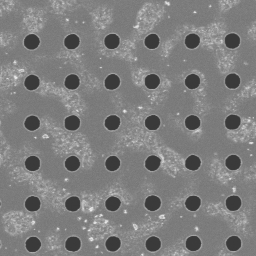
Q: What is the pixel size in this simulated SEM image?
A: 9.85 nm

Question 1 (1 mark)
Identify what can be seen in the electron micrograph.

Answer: a regular array of holes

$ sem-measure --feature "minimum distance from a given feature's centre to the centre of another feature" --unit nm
394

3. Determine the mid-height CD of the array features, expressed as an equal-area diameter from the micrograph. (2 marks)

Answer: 152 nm